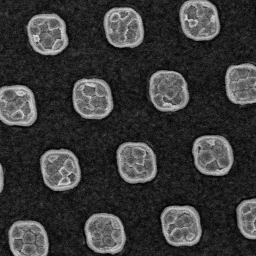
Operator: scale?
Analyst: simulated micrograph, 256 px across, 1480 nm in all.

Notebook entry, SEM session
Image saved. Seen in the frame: a regular array of raised bodies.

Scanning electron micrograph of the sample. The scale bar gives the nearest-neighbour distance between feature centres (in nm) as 442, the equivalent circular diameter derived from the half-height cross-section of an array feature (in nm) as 229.